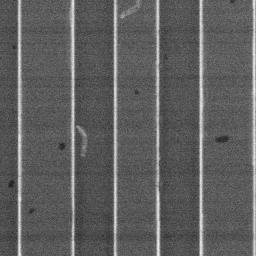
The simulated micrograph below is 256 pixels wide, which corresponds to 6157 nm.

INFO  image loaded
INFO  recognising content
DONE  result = lines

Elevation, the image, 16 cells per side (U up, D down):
DUUUUDDUUUDDDUUU
DUUUUDDUUUDDDUUU
DUUUUDDUUUDDDUUU
DUUUUDDUUUDDDUUU
DUUUUDDUUUDDDUUU
DUUUUDDUUUDDDUUU
DUUUUDDUUUDDDUUU
DUUUUDDUUUDDDUUU
DUUUUDDUUUDDDUUU
DUUUUDDUUUDDDUUU
DUUUUDDUUUDDDUUU
DUUUUDDUUUDDDUUU
DUUUUDDUUUDDDUUU
DUUUUDDUUUDDDUUU
DUUUUDDUUUDDDUUU
DUUUUDDUUUDDDUUU